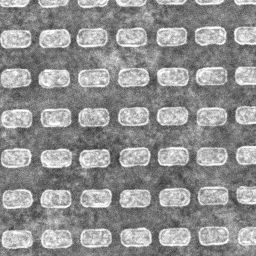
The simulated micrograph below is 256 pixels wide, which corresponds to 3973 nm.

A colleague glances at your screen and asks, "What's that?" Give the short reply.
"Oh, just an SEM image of a regular array of raised bodies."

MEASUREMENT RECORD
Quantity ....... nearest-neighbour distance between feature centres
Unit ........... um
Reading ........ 0.604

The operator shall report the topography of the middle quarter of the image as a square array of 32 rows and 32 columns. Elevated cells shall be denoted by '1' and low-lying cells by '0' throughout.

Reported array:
00000000000000000000000000000000
00000000111000011111000011111100
10001111111000111111100011111110
10001111111000111111100011111110
10001111111000111111100011111110
00000111110000000000000000000000
00000000000000000000000000000000
00000000000000000000000000000000
00000000000000000000000000000000
00000000000000000000000000000000
00000000000000000000000000000000
10000111110000111111100011111110
11001111111000111111100011111110
11001111111000111111100011111110
11001111111000111111100011111100
00000000000000000000000000000000
00000000000000000000000000000000
00000000000000000000000000000000
00000000000000000000000000000000
00000000000000000000000000000000
00000000000000000000000000000000
00000000000000011111100011111100
11001111111000111111100011111110
11001111111000111111100011111110
11001111111000111111100011111110
00000111111000000000000000000000
00000000000000000000000000000000
00000000000000000000000000000000
00000000000000000000000000000000
00000000000000000000000000000000
00000000000000000000000000000000
00000000001000000010000001111110